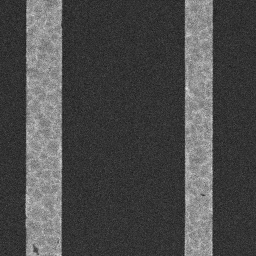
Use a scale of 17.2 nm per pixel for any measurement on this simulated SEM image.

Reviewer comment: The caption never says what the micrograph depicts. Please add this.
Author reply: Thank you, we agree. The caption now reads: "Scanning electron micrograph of one or a few lines or trenches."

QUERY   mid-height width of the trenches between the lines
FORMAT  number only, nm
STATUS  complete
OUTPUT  2120